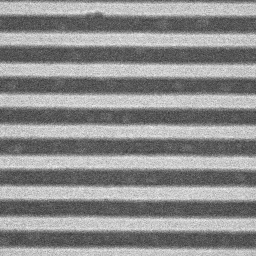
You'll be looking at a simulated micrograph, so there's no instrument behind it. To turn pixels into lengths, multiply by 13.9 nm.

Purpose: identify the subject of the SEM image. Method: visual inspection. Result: parallel lines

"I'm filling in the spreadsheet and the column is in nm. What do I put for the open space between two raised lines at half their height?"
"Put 230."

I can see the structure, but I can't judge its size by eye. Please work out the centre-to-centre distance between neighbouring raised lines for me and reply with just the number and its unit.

428 nanometers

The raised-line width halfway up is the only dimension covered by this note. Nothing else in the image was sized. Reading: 195 nm